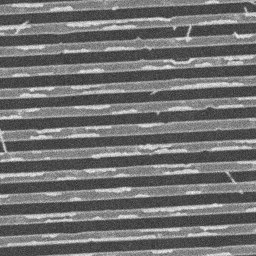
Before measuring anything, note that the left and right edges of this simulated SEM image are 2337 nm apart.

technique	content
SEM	parallel lines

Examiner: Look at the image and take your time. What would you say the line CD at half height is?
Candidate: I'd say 0.0889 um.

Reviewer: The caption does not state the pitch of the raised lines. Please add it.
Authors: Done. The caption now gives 192 nm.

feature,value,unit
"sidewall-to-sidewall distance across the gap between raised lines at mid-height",105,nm